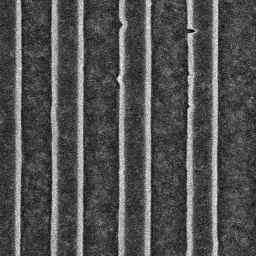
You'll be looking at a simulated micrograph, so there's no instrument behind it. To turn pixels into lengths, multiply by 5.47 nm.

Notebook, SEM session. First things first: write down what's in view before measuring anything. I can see one or a few lines or trenches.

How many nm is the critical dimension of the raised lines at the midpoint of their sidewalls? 144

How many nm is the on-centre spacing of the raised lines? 370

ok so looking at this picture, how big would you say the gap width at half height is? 222 nm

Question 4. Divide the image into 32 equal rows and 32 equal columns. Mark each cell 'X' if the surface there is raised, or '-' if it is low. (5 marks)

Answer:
XX-----XXX-----XXXX-----XXX-----
XX-----XXX-----XXXX-----XXX-----
XX-----XXX-----XXXX-----XXX-----
XX-----XXX-----XXXX-----XXX-----
XX-----XXX-----XXXX-----XXX-----
XX-----XXX-----XXXX-----XXX-----
XX-----XXX-----XXXX-----XXX-----
XX-----XXX-----XXXX-----XXX-----
XX-----XXX-----XXXX-----XXX-----
XX-----XXX-----XXXX-----XXX-----
XX-----XXX-----XXXX-----XXX-----
XX-----XXX-----XXXX-----XXX-----
XX-----XXX-----XXXX-----XXX-----
XX-----XXX-----XXXX-----XXX-----
XX-----XXX-----XXXX-----XXX-----
XX-----XXX-----XXXX-----XXX-----
XX-----XXX-----XXXX-----XXX-----
XX-----XXX-----XXXX-----XXX-----
XX-----XXX-----XXXX-----XXX-----
XX-----XXX-----XXXX-----XXX-----
XX-----XXX-----XXXX-----XXX-----
XX-----XXX-----XXXX-----XXX-----
XX-----XXX-----XXX------XXX-----
XX-----XXX-----XXX------XXX-----
XX-----XXX-----XXXX-----XXX-----
XX-----XXX-----XXXX-----XXX-----
XX-----XXX-----XXX------XXX-----
XX-----XXX-----XXX------XXX-----
XX-----XXX-----XXX------XXX-----
XX-----XXX-----XXX------XXX-----
XX-----XXX-----XXX------XXX-----
XX-----XXX-----XXX------XXX-----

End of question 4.